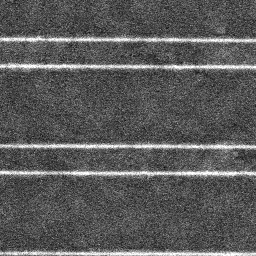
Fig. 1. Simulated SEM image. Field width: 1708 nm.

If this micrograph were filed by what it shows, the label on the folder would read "one or a few lines or trenches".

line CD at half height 27.4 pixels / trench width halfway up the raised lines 0.529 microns